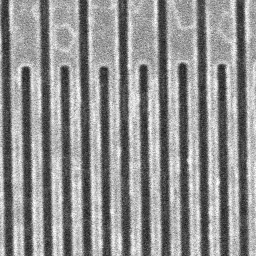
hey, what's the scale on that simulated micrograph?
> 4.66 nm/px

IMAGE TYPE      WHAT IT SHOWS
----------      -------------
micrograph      parallel lines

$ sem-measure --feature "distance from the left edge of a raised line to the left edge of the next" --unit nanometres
91.4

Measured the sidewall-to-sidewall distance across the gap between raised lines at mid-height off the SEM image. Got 39.6 nm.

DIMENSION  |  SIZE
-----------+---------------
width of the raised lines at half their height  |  51.3 nanometers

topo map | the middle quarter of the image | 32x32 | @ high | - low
-@@@--@@@@-@@@--@@@--@@---@@---@
-@@@--@@@--@@@--@@@--@@@--@@---@
--@@--@@@--@@@--@@@--@@@--@@---@
--@@--@@@--@@@--@@@--@@@--@@---@
--@@--@@@--@@@--@@@--@@@--@@---@
--@@--@@@--@@@--@@@--@@@--@@---@
--@@--@@@--@@@--@@@--@@@--@@---@
--@@--@@@--@@@--@@@--@@@--@@---@
--@@--@@@--@@@--@@@--@@@--@@@--@
--@@---@@--@@@--@@@--@@@--@@@--@
--@@---@@--@@@--@@@--@@@--@@@--@
--@@---@@--@@@--@@@--@@@--@@@--@
--@@---@@--@@@--@@@--@@@--@@@--@
--@@---@@--@@@--@@@--@@@--@@@--@
--@@---@@--@@@--@@@--@@@--@@@--@
--@@---@@--@@@--@@@--@@@--@@@--@
--@@---@@--@@@--@@@--@@@--@@@--@
--@@---@@---@@--@@@--@@@--@@@--@
--@@---@@---@@--@@@--@@@--@@@--@
--@@---@@---@@--@@@--@@@--@@@--@
--@@---@@---@@--@@@--@@@--@@@--@
--@@---@@---@@--@@@--@@@--@@@--@
--@@---@@---@@--@@@--@@@--@@@--@
--@@---@@---@@--@@@--@@@--@@@--@
--@@---@@---@@--@@@--@@@--@@@--@
--@@---@@---@@---@@--@@@--@@@--@
--@@---@@---@@---@@--@@@--@@@--@
--@@---@@---@@---@@--@@@--@@@--@
--@@---@@---@@---@@--@@@--@@@--@
--@@---@@---@@--@@@--@@@--@@@--@
--@@---@@---@@--@@@--@@@--@@@--@
--@@---@@---@@--@@@--@@@--@@@--@